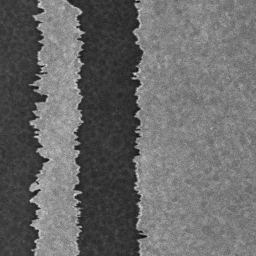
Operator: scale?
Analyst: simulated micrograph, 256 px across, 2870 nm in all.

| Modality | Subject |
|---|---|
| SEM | one or a few lines or trenches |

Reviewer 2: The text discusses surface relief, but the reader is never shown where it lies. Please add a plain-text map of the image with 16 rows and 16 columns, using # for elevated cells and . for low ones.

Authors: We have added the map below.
...##....#######
..###....#######
...##....#######
..###....#######
...##....#######
..###....#######
...##....#######
..###....#######
..###....#######
...##....#######
...##....#######
..###....#######
..###....#######
..###....#######
..###....#######
..###....#######